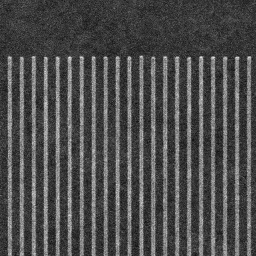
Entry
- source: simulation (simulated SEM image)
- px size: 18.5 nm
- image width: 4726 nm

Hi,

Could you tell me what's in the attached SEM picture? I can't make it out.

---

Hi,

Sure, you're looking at parallel lines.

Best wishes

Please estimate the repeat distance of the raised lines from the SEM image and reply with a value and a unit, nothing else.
12 px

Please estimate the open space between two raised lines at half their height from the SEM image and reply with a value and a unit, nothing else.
166 nanometers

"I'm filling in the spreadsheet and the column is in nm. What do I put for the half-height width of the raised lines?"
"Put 55.4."